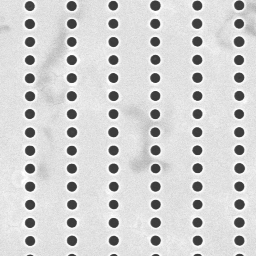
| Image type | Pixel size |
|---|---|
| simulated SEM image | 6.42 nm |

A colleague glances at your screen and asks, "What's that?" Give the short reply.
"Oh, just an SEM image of a regular array of holes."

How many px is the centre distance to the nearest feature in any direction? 17.9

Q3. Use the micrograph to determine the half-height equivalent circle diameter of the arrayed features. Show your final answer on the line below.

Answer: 10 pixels